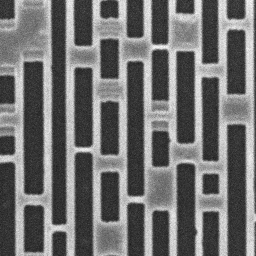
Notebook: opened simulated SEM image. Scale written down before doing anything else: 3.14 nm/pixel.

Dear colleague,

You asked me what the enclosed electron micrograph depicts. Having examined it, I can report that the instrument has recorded parallel lines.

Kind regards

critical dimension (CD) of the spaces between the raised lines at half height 56.1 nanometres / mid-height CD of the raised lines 22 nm